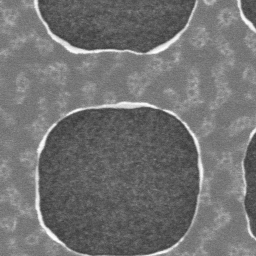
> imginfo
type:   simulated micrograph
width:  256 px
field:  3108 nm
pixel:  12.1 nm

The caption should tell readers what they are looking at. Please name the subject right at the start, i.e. holes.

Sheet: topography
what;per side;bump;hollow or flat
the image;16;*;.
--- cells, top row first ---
**..........***.
***.........****
****.......*****
****************
****************
****************
****************
****.......*****
***.........****
***.........***.
**..........***.
**...........**.
**..........***.
***.........***.
***.........****
****.......*****